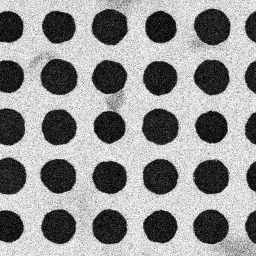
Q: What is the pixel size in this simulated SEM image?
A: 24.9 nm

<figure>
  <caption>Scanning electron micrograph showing a regular array of holes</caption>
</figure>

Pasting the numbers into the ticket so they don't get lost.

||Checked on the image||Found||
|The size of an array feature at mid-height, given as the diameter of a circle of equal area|869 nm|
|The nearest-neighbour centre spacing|1240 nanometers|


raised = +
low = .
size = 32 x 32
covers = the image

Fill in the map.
++++++++++++++++++++++++++++++++
..++++..++++...++++..++++...++++
...++....+++....++....++.....++.
...++....+++....++....++.....++.
...+++...+++....++....+++....++.
+++++++++++++..+++++++++++.+++++
++++++++++++++++++++++++++++++++
++++++..++++++++++++++++++++++++
...++....+++...+++....+++...+++.
...++.....++....++....++.....++.
...++.....++....++....+++....++.
+.++++...++++..++++..++++...++++
++++++++++++++++++++++++++++++++
++++++++++++++++++++++++++++++++
...+++...+++...+++....+++...+++.
...++....+++....++....++....+++.
...++....+++....++....+++...+++.
...+++...++++..++++...+++...+++.
++++++++++++++++++++++++++++++++
++++++++++++++++++++++++++++++++
...+++...+++...++++...+++...++++
...++....+++....++....++....+++.
...++....+++....++....++.....++.
...+++...+++...+++....+++...+++.
++++++++++++++++++++++++++++++++
++++++++++++++++++++++++++++++++
..++++..+++++..++++..++++..+++++
...++....+++....++....++....+++.
...++....+++....++....++.....++.
...+++...+++....++....++....+++.
+++++++.+++++.++++++++++++.+++++
++++++++++++++++++++++++++++++++